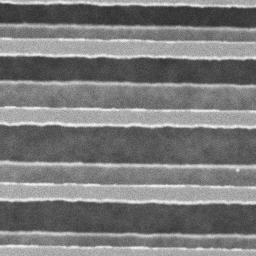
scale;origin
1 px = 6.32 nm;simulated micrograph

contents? lines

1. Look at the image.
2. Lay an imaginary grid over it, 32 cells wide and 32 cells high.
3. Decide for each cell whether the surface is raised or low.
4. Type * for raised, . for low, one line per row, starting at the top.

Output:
..**.*.....*********************
................................
................................
************************........
********************************
********************************
********************************
................................
................................
................................
*****************...............
********************************
********************************
********************************
********************************
***.**.*************************
................................
................................
................................
................................
***.*...........................
********************************
********************************
********************************
********************************
..............................*.
................................
................................
................................
********************************
********************************
********************************